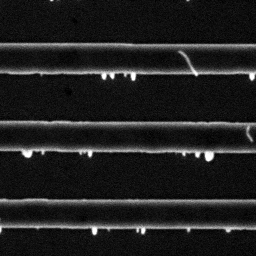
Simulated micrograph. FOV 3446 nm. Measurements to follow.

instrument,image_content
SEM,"lines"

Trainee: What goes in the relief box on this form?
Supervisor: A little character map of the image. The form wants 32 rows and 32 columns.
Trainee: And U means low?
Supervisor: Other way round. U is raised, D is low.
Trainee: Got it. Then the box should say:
DDDDDDDDDDDDDDDDDDDDDDDDDDDDDDDD
DDDDDDDDDDDDDDDDDDDDDDDDDDDDDDDD
DDDDDDDDDDDDDDDDDDDDDDDDDDDDDDDD
DDDDDDDDDDDDDDDDDDDDDDDDDDDDDDDD
DDDDDDDDDDDDDDDDDDDDDDDDDDDDDDDD
DDDDDDDDDDDDDDDDDDDDDDDDDDDDDDDD
UUUUUUUUUUUUUUUUUUUUUUUUUUUUUUUU
UUUUUUUUUUUUUUUUUUUUUUUUUUUUUUUU
UUUUUUUUUUUUUUUUUUUUUUUUUUUUUUUU
DDDDDDDDDDDDDDDDUDDDDDDDDDDDDDDU
DDDDDDDDDDDDDDDDDDDDDDDDDDDDDDDD
DDDDDDDDDDDDDDDDDDDDDDDDDDDDDDDD
DDDDDDDDDDDDDDDDDDDDDDDDDDDDDDDD
DDDDDDDDDDDDDDDDDDDDDDDDDDDDDDDD
DDDDDDDDDDDDDDDDDDDDDDDDDDDDDDDD
UUUUUUUUUUUUUUUUUUUUUUUUUUUUUUUU
UUUUUUUUUUUUUUUUUUUUUUUUUUUUUUUU
UUUUUUUUUUUUUUUUUUUUUUUUUUUUUUUU
UUUUUUUUUUUUUUUUUUUUUUUUUUUUUUUU
DDDDDDDDDDDDDDDDDDDDDDDDDDUDDDDD
DDDDDDDDDDDDDDDDDDDDDDDDDDDDDDDD
DDDDDDDDDDDDDDDDDDDDDDDDDDDDDDDD
DDDDDDDDDDDDDDDDDDDDDDDDDDDDDDDD
DDDDDDDDDDDDDDDDDDDDDDDDDDDDDDDD
DDDDDDDDDDDDDDDDDDDDDDDDDDDDDDDD
UUUUUUUUUUUUUUUUUUUUUUUUUUUUUUUU
UUUUUUUUUUUUUUUUUUUUUUUUUUUUUUUU
UUUUUUUUUUUUUUUUUUUUUUUUUUUUUUUU
DDDDDDDDDDDUUDDDDUUDDDDUDDDDUUUU
DDDDDDDDDDDDDDDDDDDDDDDDDDDDDDDD
DDDDDDDDDDDDDDDDDDDDDDDDDDDDDDDD
DDDDDDDDDDDDDDDDDDDDDDDDDDDDDDDD